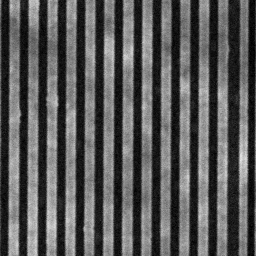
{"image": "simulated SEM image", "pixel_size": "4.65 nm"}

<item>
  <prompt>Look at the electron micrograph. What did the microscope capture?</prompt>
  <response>parallel lines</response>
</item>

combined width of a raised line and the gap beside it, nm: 89.1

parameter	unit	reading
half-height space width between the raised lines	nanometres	43.6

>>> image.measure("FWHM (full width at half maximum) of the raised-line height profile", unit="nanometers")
44.2